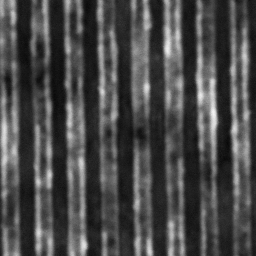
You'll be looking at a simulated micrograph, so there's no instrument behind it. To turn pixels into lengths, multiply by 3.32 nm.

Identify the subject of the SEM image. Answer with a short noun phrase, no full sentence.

parallel lines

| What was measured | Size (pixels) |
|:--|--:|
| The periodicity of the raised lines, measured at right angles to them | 33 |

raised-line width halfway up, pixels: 16.4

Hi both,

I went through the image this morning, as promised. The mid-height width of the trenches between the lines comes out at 54.3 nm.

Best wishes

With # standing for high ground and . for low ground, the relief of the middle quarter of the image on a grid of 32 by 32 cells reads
.###.....####....####....####...
.###.....####....####....####...
####.....####....####....####...
####.....####....####....####...
####.....####....####.....###...
#####....####....####.....###...
.####....####....####.....###...
.####....####....####.....###...
.####....####....####.....###...
.####....####....####.....###...
.###.....####....####.....###...
.###.....####....####.....###...
.####....#####...####....####...
.####....####.....###....####...
.####....####.....###.....###...
.####....####.....###.....###...
.####....####.....###.....###...
.####....####.....###.....###...
.####....####.....###.....###...
.####....####.....###.....###...
.####....####.....###.....###...
.####....####....####.....###...
.####....####.....###.....###...
.####....####.....###.....####..
.####....####.....###.....####..
.####....####.....###.....####..
.####....####.....###.....####..
.####....####.....###.....####..
.####....####.....###.....####..
.####....####.....###.....####..
.####....####....####.....####..
.####....####....####.....####..